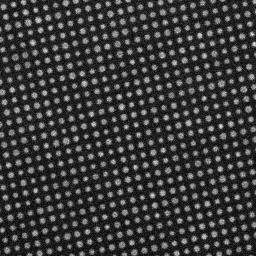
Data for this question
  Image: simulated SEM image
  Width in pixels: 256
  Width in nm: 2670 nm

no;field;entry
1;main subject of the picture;a regular array of raised bodies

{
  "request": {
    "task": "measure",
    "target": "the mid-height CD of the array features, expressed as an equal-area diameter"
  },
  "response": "4.65 px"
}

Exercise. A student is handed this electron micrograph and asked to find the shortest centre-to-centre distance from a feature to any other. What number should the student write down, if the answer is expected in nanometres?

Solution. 106